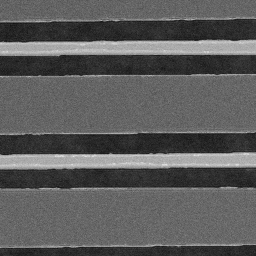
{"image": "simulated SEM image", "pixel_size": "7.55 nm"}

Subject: lines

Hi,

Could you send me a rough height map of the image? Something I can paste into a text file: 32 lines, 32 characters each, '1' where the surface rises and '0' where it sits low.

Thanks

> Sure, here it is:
11111111111111111111111111111111
11111111111111111111111111111111
11111111111111100000000000000000
00000000000000000000000000000000
00000000000000000000000000000000
11111111111111111111111111111111
11111111111111111111111111111111
00000000000000000000000000000000
00000000000000000000000000000000
00000000111111111111111111111111
11111111111111111111111111111111
11111111111111111111111111111111
11111111111111111111111111111111
11111111111111111111111111111111
11111111111111111111111111111111
11111111111111111111111111111111
11111111111111111111111111111111
00000000000000000000000000000000
00000000000000000000000000000000
11111111111111111111111111111111
11111111111111111111111111111111
00000000000000000000000000000000
00000000000000000000000000000000
00000000000000000000000000011100
11111111111111111111111111111111
11111111111111111111111111111111
11111111111111111111111111111111
11111111111111111111111111111111
11111111111111111111111111111111
11111111111111111111111111111111
11111111111111111111111111111111
00000000000000000000000000000000